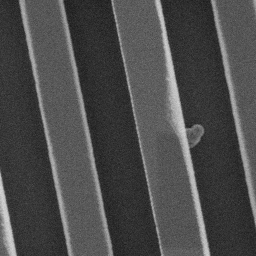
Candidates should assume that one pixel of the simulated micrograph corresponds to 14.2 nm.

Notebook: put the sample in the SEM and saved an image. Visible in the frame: lines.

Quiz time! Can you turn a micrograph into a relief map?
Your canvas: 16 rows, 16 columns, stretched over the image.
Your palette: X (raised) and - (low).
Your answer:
-XXX---XXX---XXX
--XX---XXX----XX
--XX---XXX----XX
--XXX---XXX---XX
--XXX---XXX---XX
--XXX---XXX---XX
--XXX---XXX----X
---XX---XXX----X
---XXX---XXX---X
---XXX---XXX---X
---XXX---XXX---X
---XXX---XXX---X
----XX---XXX----
----XXX---XXX---
X---XXX---XXX---
X---XXX---XXX---